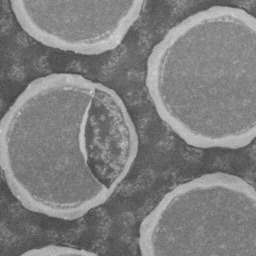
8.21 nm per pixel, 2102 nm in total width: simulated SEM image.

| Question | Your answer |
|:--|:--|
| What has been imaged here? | raised bodies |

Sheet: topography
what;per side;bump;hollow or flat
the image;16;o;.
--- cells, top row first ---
.oooooooo.......
..oooooo....oooo
...oooo....ooooo
..........oooooo
..........oooooo
..oooo....oooooo
.ooooo....oooooo
ooooo......ooooo
ooooo.......oooo
ooooo...........
oooooo..........
.ooooo......ooo.
..oooo....oooooo
..........oooooo
.........ooooooo
.........ooooooo